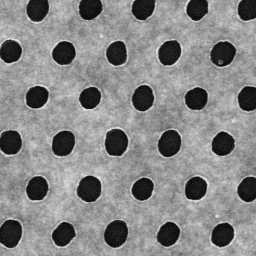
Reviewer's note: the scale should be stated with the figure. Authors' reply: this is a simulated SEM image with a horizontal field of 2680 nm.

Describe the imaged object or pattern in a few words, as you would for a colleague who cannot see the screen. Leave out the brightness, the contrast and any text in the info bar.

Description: a regular array of holes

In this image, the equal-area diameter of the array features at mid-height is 258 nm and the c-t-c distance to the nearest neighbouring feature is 0.542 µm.